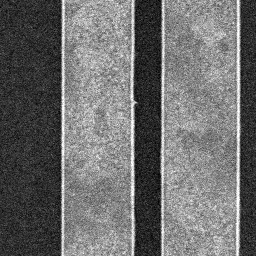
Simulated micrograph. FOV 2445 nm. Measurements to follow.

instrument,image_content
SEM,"one or a few lines or trenches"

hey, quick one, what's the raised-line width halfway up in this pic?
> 690 nm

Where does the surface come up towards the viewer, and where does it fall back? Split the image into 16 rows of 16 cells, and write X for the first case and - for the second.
----XXXX--XXXXX-
----XXXX--XXXXX-
----XXXX--XXXXX-
----XXXX--XXXXX-
----XXXX--XXXXX-
----XXXX--XXXXX-
----XXXX--XXXXX-
----XXXX--XXXXX-
----XXXX--XXXXX-
----XXXX--XXXXX-
----XXXX--XXXXX-
----XXXX--XXXXX-
----XXXX--XXXXX-
----XXXX--XXXXX-
----XXXX--XXXXX-
----XXXX--XXXXX-